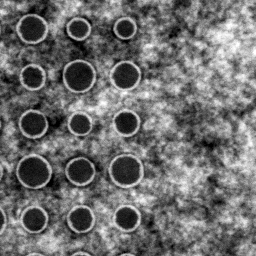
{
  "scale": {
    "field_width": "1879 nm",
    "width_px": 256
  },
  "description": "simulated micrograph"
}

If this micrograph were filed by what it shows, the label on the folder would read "a regular array of raised bodies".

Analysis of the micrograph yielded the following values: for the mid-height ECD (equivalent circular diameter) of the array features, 197 nanometers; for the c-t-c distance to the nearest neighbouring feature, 340 nanometres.